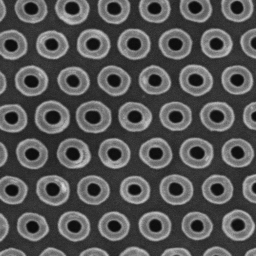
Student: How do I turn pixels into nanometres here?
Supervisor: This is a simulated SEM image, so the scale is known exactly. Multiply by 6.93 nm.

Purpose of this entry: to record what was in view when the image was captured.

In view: a regular array of ring-shaped raised bodies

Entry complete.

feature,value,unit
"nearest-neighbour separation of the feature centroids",283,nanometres